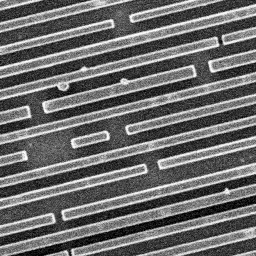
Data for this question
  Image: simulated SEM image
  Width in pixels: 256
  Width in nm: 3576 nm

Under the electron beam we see parallel lines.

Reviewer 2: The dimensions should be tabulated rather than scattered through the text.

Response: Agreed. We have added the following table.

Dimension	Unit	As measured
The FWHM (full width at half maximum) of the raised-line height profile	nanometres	120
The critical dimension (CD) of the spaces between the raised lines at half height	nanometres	173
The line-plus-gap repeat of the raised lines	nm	301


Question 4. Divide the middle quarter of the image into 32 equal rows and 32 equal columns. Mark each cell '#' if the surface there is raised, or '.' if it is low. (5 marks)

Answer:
.........#########..............
....##########..............####
.#########..............########
######..............###########.
##............#############.....
#...........###########.........
........##########.............#
....##########.............#####
##########.............#######..
######.............#######......
##............########..........
..........########..............
......########..............####
..########..............########
######..............#########...
##..............#########.......
................#####...........
........###...................##
....#######...............######
..#######.............########..
..###............#########......
.............########...........
.........########..............#
.....########..............#####
.########...............#######.
#####.............##....###.....
#.............#######...........
..........#########.............
......#########.................
..#########..................###
#######..................#######
###..................##########.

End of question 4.